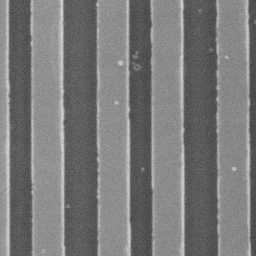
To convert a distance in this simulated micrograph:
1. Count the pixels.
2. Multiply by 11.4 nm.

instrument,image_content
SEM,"lines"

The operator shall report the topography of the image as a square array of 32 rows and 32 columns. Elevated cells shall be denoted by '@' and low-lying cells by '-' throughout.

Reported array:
@---@@@@----@@@@---@@@@----@@@@-
@---@@@@----@@@@---@@@@----@@@@-
@---@@@@----@@@@---@@@@----@@@@-
@---@@@@----@@@@---@@@@----@@@@-
@---@@@@----@@@@---@@@@----@@@@-
@---@@@@----@@@@---@@@@----@@@@-
@---@@@@----@@@@---@@@@----@@@@-
@---@@@@----@@@@---@@@@----@@@@-
@---@@@@----@@@@---@@@@----@@@@-
@---@@@@----@@@@---@@@@----@@@@-
@---@@@@----@@@@---@@@@----@@@@-
@---@@@@----@@@@---@@@@----@@@@-
@---@@@@----@@@@---@@@@----@@@@-
@---@@@@----@@@@---@@@@----@@@@-
@---@@@@----@@@@---@@@@----@@@@-
@---@@@@----@@@@---@@@@----@@@@-
@---@@@@----@@@@---@@@@----@@@@-
@---@@@@----@@@@---@@@@----@@@@-
@---@@@@----@@@@---@@@@----@@@@-
@---@@@@----@@@@---@@@@----@@@@-
@---@@@@----@@@@---@@@@----@@@@-
@---@@@@----@@@@---@@@@----@@@@-
@---@@@@----@@@@---@@@@----@@@@-
@---@@@@----@@@@---@@@@----@@@@-
@---@@@@----@@@@---@@@@----@@@@-
@---@@@@----@@@@---@@@@----@@@@-
@---@@@@----@@@@---@@@@----@@@@-
@---@@@@----@@@@---@@@@----@@@@-
@---@@@@----@@@@---@@@@----@@@@-
@---@@@@----@@@@---@@@@----@@@@-
@---@@@@----@@@@---@@@@----@@@@-
@---@@@@----@@@@---@@@@----@@@@-